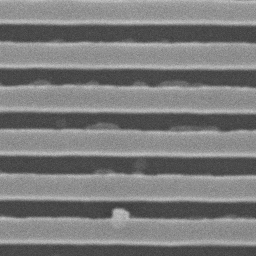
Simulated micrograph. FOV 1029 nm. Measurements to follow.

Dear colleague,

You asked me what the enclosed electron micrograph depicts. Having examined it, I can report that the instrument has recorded lines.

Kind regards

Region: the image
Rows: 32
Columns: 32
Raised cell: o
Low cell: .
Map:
oooooooooooooooooooooooooooooooo
oooooooooooooooooooooooooooooooo
oooooooooooooooooooooooooooooooo
................................
................................
oooooooooooooooo..oo..ooo.ooooo.
oooooooooooooooooooooooooooooooo
oooooooooooooooooooooooooooooooo
...................ooooooooooooo
................................
................................
oooooooooooooooooooooooooooooooo
oooooooooooooooooooooooooooooooo
oooooooooooooooooooooooooooooooo
................................
................................
ooooooooooooooooooooo....ooo.ooo
oooooooooooooooooooooooooooooooo
oooooooooooooooooooooooooooooooo
................................
................................
................................
oooooooooooooooooooooooooooooooo
oooooooooooooooooooooooooooooooo
oooooooooooooooooooooooooooooooo
................................
..............oo................
ooooooooooooooooooooooo..ooooooo
oooooooooooooooooooooooooooooooo
oooooooooooooooooooooooooooooooo
...................oooo........o
................................